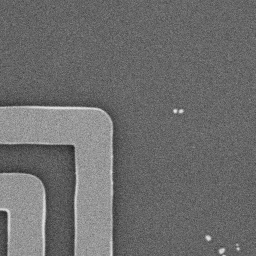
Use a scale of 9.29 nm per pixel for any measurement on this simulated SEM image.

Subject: groups of lines, slits or small figures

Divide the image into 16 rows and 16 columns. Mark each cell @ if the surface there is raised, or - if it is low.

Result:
----------------
----------------
----------------
----------------
----------------
----------------
----------------
@@@@@@@---------
@@@@@@@---------
-----@@---------
-----@@---------
@@@--@@---------
@@@--@@---------
@@@--@@---------
-@@--@@---------
-@@--@@---------